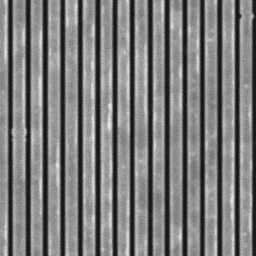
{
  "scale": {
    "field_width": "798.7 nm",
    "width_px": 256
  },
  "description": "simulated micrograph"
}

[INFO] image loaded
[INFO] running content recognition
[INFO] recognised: parallel lines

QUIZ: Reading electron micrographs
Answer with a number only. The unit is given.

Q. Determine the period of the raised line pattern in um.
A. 0.0544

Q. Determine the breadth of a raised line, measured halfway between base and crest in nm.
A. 35.8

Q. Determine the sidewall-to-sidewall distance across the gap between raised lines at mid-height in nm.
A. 17.9